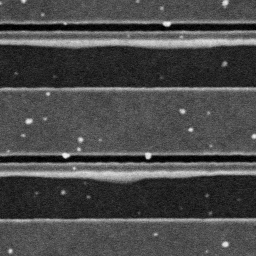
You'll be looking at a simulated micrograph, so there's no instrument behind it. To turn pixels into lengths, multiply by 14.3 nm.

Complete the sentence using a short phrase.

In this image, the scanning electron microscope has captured lines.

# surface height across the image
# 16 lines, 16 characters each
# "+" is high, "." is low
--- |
++++++++++++++++
++++++++++++++++
++++++++++++++++
................
................
................
++++++++++++++++
++++++++++++++++
++++++++++++++++
++++++++++++++++
++++++++++++++++
................
................
................
++++++++++++++++
++++++++++++++++